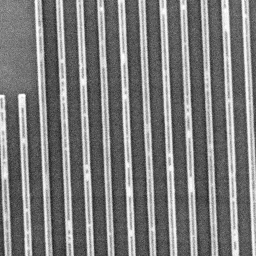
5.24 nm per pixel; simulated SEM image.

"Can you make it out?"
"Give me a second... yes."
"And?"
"parallel lines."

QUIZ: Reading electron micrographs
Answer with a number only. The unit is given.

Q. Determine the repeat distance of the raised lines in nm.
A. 108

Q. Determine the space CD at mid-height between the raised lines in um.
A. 0.0811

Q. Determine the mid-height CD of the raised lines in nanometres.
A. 30.1